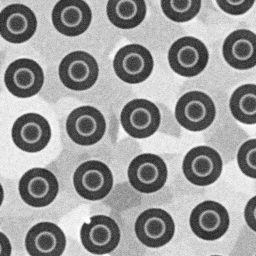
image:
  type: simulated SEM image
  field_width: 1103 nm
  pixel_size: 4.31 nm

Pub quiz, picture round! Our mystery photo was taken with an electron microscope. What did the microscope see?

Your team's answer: an array of small figures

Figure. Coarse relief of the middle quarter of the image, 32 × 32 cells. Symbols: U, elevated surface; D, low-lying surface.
DDUUUUDDDUUUDDDUUUUUDDUUUUDDDDUU
DUUUUUDDDUUUDDDUUUUDDDUUUUUDDDDD
DUUUUUDDDUUUUDDDDDDDDDUUUUUUDDDD
DDUUUDDDDUUUUUDDDDDDDUUUUUUUUUDD
DDDDDDDDUUUUUUUDDDDDUUUUUUUUUUUU
DDDDDDDUUUUUUUUUUUUUUUUUUUUUUUUU
UUDDDDUUUUUUUUUUUUUUUUUUUUUUUUUU
UUUUUUUUUUUUUUUUUUUUUUUUUUUUUUDD
UUUUUUUUUUUUUUUUUUDUUUUUUUUUUDDD
UUUUUUUUUUUUUUUUDDDDDDUUUUUUDDDD
UUUUDDDUUUUUUUUDDDDDDDDUUUUUDDDU
UUDDDDDDDUUUUUDDDDUUDDDDUUUDDDUU
UDDDDDDDDDUUUUDDDUUUUDDDUUUUDDUU
UDDDUUUDDDUUUUDDDUUUUUDDUUUUDDDU
DDDUUUUUDDUUUUDDDUUUUDDDUUUUDDDD
DDDUUUUUDDDUUUDDDDUUUDDDUUUUUDDD
UDDUUUUUDDDUUUUDDDDDDDDUUUUUUUUD
UDDDUUUDDDUUUUUUDDDDDDUUUUUUUUUU
UDDDDDDDDDUUUUUUUDDDDUUUUUUUUUUU
UUDDDDDDUUUUUUUUUUUUUUUUUUUUUUUU
UUUUUDUUUUUUUUUUUUUUUUUUUUUUUUUU
UUUUUUUUUUUUUUUUUUUUUUUUUUUUUUUD
UUUUUUUUUUUUUUUUUUUDDDDUUUUUUUDD
UUUUUUUUUUUUUUUUUUDDDDDDUUUUUUDD
UUUUUDDDDDUUUUUUUDDDDDDDDUUUUUDD
UUUUDDDDDDDUUUUUDDDUUUUDDDUUUDDD
UUUDDDDDDDDDUUUUDDDUUUUDDDUUUDDD
UUDDDUUUUDDDUUUUDDUUUUUDDDUUUUDD
UUDDDUUUUUDDUUUUDDDUUUUDDDUUUUDD
UUDDDUUUUUDDDUUUDDDDUUDDDDUUUUUD
UUDDDUUUUDDDUUUUUDDDDDDDDUUUUUUU
UUUDDDUDDDDDUUUUUUDDDDDDUUUUDUUU